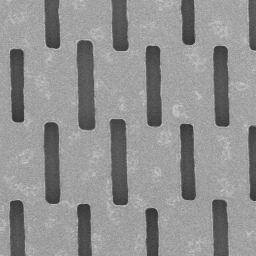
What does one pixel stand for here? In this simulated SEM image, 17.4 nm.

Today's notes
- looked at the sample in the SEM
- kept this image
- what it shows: holes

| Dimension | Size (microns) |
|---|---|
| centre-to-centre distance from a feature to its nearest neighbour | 1.18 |